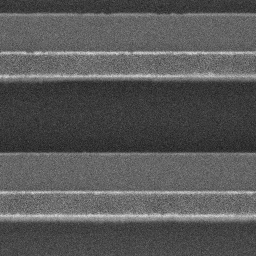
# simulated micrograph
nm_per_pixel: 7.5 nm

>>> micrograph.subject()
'lines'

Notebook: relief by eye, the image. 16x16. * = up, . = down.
................
****************
****************
****************
****************
................
................
................
................
................
****************
****************
****************
****************
................
................